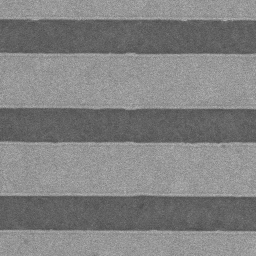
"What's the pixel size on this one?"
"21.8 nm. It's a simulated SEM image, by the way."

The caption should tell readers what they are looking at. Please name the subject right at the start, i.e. one or a few lines or trenches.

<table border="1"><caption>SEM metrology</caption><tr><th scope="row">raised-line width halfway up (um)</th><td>1.15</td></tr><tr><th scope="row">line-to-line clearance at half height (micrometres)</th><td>0.789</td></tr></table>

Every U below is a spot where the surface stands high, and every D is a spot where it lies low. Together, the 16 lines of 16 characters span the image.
UUUUUUUUUUUUUUUU
DDDDDDDDDDDDDDDD
DDDDDDDDDDDDDDDD
UUUUUUUUUUUUUUUU
UUUUUUUUUUUUUUUU
UUUUUUUUUUUUUUUU
UUUUUUUUUUUUUUUU
DDDDDDDDDDDDDDDD
DDDDDDDDDDDDDDDD
UUUUUUUUUUUUUUUU
UUUUUUUUUUUUUUUU
UUUUUUUUUUUUUUUU
DDDDDDDDDDDDDDDD
DDDDDDDDDDDDDDDD
UUUUUUUDDUDDDUDD
UUUUUUUUUUUUUUUU